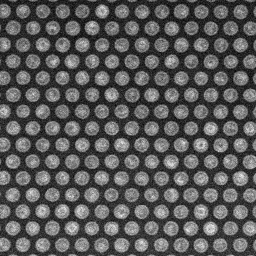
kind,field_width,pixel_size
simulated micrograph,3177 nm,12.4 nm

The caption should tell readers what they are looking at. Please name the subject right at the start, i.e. a regular array of raised bodies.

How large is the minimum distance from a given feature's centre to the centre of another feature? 236 nm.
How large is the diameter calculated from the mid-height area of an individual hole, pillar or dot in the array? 171 nanometers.